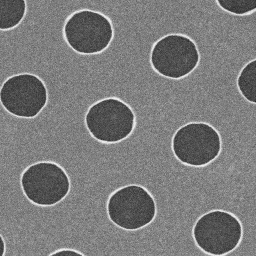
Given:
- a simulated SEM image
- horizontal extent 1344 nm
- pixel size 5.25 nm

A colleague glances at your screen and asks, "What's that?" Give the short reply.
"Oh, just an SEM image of holes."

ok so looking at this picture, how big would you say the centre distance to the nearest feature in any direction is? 471 nanometers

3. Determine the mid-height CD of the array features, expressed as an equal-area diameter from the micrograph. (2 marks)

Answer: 44.6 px